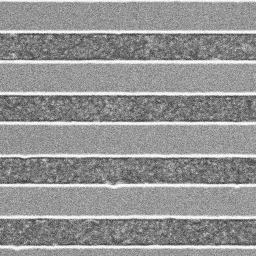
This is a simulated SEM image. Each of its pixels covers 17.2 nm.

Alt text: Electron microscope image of one or a few lines or trenches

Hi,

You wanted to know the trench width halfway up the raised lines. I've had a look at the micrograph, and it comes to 515 nanometers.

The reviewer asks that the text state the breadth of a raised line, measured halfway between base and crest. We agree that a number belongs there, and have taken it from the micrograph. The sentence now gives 548 nm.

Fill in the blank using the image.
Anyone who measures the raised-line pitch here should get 1060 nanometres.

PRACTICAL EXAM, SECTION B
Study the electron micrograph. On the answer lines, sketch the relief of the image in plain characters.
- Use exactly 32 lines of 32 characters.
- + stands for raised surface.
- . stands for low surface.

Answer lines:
++++++++++++++++++++++++++++++++
++++++++++++++++++++++++++++++++
++++++++++++++++++++++++++++++++
++++++++++++++++++++++++++++++++
................................
................................
................................
................................
++++++++++++++++++++++++++++++++
++++++++++++++++++++++++++++++++
++++++++++++++++++++++++++++++++
++++++++++++++++++++++++++++++++
................................
................................
................................
++++++++++++.++++.++++++++++++++
++++++++++++++++++++++++++++++++
++++++++++++++++++++++++++++++++
++++++++++++++++++++++++++++++++
+++++.+..++.+++++..+++++......++
................................
................................
................................
++++++++++++++++++++++++++++++++
++++++++++++++++++++++++++++++++
++++++++++++++++++++++++++++++++
++++++++++++++++++++++++++++++++
................................
................................
................................
................................
++++++++++++++++++++++++++++++++